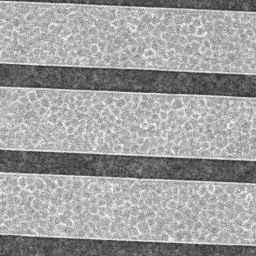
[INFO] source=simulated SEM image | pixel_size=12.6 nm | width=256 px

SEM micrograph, one or a few lines or trenches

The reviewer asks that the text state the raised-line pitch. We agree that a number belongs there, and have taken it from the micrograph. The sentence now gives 1080 nanometers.